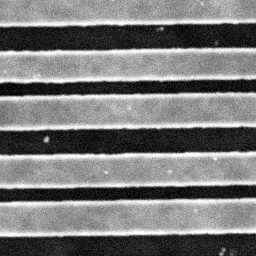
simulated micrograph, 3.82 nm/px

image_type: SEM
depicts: lines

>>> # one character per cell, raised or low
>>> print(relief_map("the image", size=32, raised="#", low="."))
################################
################################
################################
................................
................................
................................
...#.###########################
################################
################################
################################
................................
................................
################################
################################
################################
################################
................................
................................
................................
#.##############################
################################
################################
################################
................................
................................
################################
################################
################################
################################
................................
................................
................................